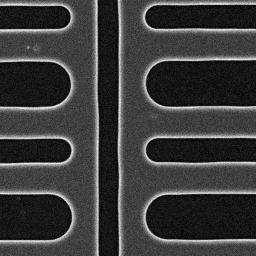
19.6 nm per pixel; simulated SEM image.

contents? groups of lines, slits or small figures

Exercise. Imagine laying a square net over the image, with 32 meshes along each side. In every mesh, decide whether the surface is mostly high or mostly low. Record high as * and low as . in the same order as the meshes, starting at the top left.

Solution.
************...*****************
.........***...***..............
.........***...***..............
........****...****.............
************...*****************
************...*****************
************...*****************
************...***********......
........****...****.............
.........***...***..............
.........***...***..............
.........***...***..............
........****...****.............
***...******...*****************
************...*****************
************...*****************
************...*****************
........****...****.............
.........***...***..............
.........***...***..............
.***********...*****************
************...*****************
************...*****************
************...*****************
.......*****...*****............
.........***...****.............
.........***...***..............
.........***...***..............
.........***...****.............
........****...****.............
************...*****************
************...*****************